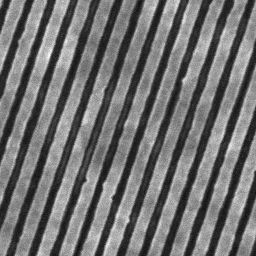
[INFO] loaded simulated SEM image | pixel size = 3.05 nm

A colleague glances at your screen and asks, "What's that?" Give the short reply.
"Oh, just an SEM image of parallel lines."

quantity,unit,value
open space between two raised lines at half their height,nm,28.6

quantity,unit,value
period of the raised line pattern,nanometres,64.1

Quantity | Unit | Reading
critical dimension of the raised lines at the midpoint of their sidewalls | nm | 34.3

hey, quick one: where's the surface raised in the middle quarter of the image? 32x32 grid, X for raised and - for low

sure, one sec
X---XXX--XXX---XXX--XXX---XXX--X
X---XXX--XXX---XXX--XXX---XXX--X
X--XXX---XXX--XXX---XXX--XXX---X
---XXX--XXXX--XXX--XXX---XXX--XX
---XX---XXX---XX---XXX---XXX--XX
--XXX---XXX--XXX---XXX--XXX---XX
--XXX--XXX---XXX--XXX---XXX--XXX
--XX---XXX--XXX---XXX---XXX--XXX
-XXX---XXX--XXX---XXX--XXX---XXX
-XXX--XXX---XXX--XXX---XXX---XX-
XXX---XXX--XXXX--XXX---XX---XXX-
XXX---XXX--XXX---XXX--XXX---XXX-
XXX--XXX---XXX--XXX---XXX---XXX-
XX---XXX--XXXX--XXX---XXX--XXX--
XX---XXX--XXX---XXX--XXX---XXX--
XX--XXX---XXX--XXX---XXX--XXXX--
X---XXX--XXX---XXX---XXX--XXX---
X--XXXX--XXX---XXX--XXX---XXX--X
X--XXX---XXX--XXX---XXX--XXX---X
---XXX--XXX---XXX--XXXX--XXX--XX
---XXX--XXX---XXX--XXX---XXX--XX
--XXX---XXX--XXX---XXX--XXX---XX
--XXX--XXX---XXX--XXX---XXX--XXX
--XXX--XXX---XXX--XXX---XXX--XXX
-XXX---XXX--XXX---XXX--XXXX--XXX
-XXX--XXX---XXX--XXX---XXX--XXXX
-XXX--XXX---XX---XXX---XXX--XXX-
XXX---XXX--XXX---XXX--XXX---XXX-
XXX---XXX--XXX--XXXX--XXX--XXXX-
XXX---XX--XXX---XXX---XXX--XXX--
XX---XXX--XXX---XXX--XXX---XXX--
XX--XXX---XXX---XX---XXX---XX---